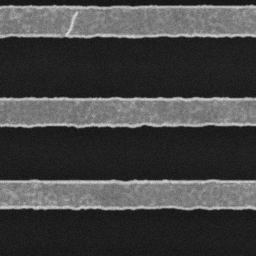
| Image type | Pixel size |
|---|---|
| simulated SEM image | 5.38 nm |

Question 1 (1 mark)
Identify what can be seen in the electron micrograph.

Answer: lines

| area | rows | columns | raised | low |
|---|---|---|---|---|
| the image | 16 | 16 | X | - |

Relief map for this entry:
XXXXXXXXXXXXXXXX
XXXXXXXXXXXXXXXX
----------------
----------------
----------------
----------------
XXXXXXXXXXXXXXXX
XXXXXXXXXXXXXXXX
----------------
----------------
----------------
XXXXXXXXXXXXXXXX
XXXXXXXXXXXXXXXX
----------------
----------------
----------------